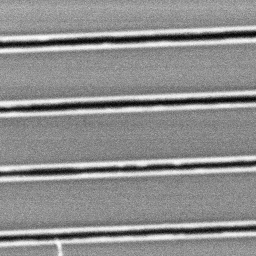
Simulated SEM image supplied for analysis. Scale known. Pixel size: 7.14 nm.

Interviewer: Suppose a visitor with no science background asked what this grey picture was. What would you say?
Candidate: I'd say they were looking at one or a few lines or trenches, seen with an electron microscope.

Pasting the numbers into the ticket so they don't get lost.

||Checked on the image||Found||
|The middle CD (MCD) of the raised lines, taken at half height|12.9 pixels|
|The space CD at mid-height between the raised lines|52.2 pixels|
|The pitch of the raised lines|0.461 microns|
